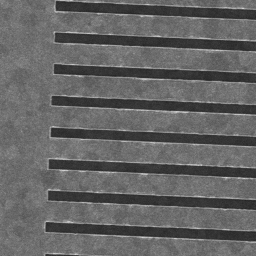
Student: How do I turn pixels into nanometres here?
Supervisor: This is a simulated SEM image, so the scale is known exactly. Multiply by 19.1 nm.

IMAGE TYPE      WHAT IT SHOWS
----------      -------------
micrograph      parallel lines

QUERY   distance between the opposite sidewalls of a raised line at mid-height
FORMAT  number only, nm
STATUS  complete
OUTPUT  401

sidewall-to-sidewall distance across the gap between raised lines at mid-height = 205 nanometres